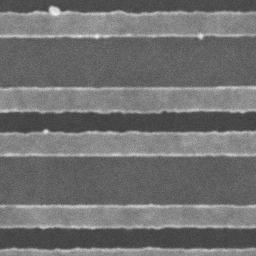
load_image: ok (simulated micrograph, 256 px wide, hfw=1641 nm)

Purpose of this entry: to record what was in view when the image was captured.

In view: lines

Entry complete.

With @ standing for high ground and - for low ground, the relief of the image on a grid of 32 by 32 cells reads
--------------------------------
----@-@@@-----@-------@-----@---
@@@@@@@@@@@@@@@@@@@@@@@@@@@@@@@@
@@@@@@@@@@@@@@@@@@@@@@@@@@@@@@@@
@@@@@@@-@@@@@@----@@----@@------
--------------------------------
--------------------------------
--------------------------------
--------------------------------
--------------------------------
--------------------------------
@@@@@@@@@@@@@@@@@@@@@@@@@@@@@@@@
@@@@@@@@@@@@@@@@@@@@@@@@@@@@@@@@
@@@@@@@@@@@@@@@@@@@@@@@@@@@@@@@@
--------------------------------
--------------------------------
-----@-----@@@--@@--------@-@@@@
@@@@@@@@@@@@@@@@@@@@@@@@@@@@@@@@
@@@@@@@@@@@@@@@@@@@@@@@@@@@@@@@@
--------------------------------
--------------------------------
--------------------------------
--------------------------------
--------------------------------
--------------------------------
--------------------------------
@@@@@@@@@@@@@@@@@@@@@@@@@@@@@@@@
@@@@@@@@@@@@@@@@@@@@@@@@@@@@@@@@
-----@---@-@----@-@@-----------@
--------------------------------
--------------------------------
@@@@@@@@@@@@@@@@@@@@@@@@@@@@@@@@